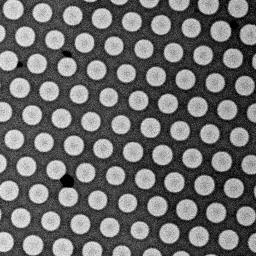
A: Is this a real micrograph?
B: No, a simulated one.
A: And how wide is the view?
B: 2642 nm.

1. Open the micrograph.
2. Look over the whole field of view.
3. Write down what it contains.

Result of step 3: an array of small figures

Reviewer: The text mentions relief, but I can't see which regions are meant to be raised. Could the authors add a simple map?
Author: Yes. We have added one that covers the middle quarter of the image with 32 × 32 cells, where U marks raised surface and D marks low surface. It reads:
UUUDDDUUUUDDDDUUUDDDDDDDDDDDDDDD
UUUDDDUUUUDDDDUUUUDDDUUUUDDDDDDD
UUDDDDUUUUDDDUUUUUDDDUUUUDDDUUUU
DDDDDDDUUDDDDDUUUDDDDUUUUDDDUUUU
DDDDDDDDDDDDDDDDDDDDDUUUUDDDUUUU
DDDUDDDDDDDDDDDDDDDDDDDDDDDDDUUU
DDUUUUDDDDUUDDDDDDDDDDDDDDDDDDDD
DDUUUUDDDUUUUDDDDUUUDDDDDDDDDDDD
DDUUUUDDDUUUUDDDUUUUUDDDUUUUDDDD
DDDUUDDDDUUUUDDDUUUUUDDDUUUUDDDU
DDDDDDDDDDDUDDDDDUUUUDDDUUUUDDDU
DDDDDDDDDDDDDDDDDDDDDDDDUUUUDDDU
UDDDDUUUDDDDDDDDDDDDDDDDDDDDDDDD
UUDDDUUUUDDDDUUUDDDDDDDDDDDDDDDD
UUDDDUUUUDDDUUUUDDDDUUUUDDDDUUDD
UDDDDUUUUDDDUUUUDDDUUUUUDDDUUUUD
DDDDDDUUDDDDUUUUDDDUUUUUDDDUUUUD
DDDDDDDDDDDDDDDDDDDDUUUDDDDUUUUD
DUUUDDDDDDDDDDDDDDDDDDDDDDDDUUUD
UUUUUDDDUUUDDDDDDDDDDDDDDDDDDDDD
UUUUUDDDUUUUDDDUUUUDDDDDUDDDDDDD
UUUUUDDUUUUUDDDUUUUUDDDUUUUDDDDU
DUUUDDDDUUUUDDDUUUUUDDUUUUUDDDUU
DDDDDDDDDDDDDDDUUUUDDDUUUUUDDDUU
DDDDDDDDDDDDDDDDDDDDDDDUUUDDDDUU
DDDDUUUDDDDDDDDDDDDDDDDDDDDDDDDU
DDDUUUUUDDDUUUUDDDDUUDDDDDDDDDDD
DDDUUUUUDDDUUUUDDDUUUUDDDDUUUDDD
DDDDUUUDDDDUUUUDDDUUUUUDDDUUUUDD
DDDDDDDDDDDUUUDDDDUUUUUDDUUUUUDD
DDDDDDDDDDDDDDDDDDDUUUDDDUUUUUDD
UUUDDDDDDDDDDDDDDDDDDDDDDDUUUDDD